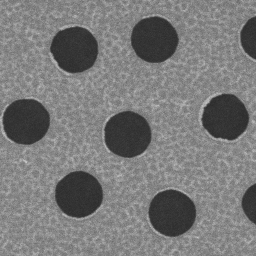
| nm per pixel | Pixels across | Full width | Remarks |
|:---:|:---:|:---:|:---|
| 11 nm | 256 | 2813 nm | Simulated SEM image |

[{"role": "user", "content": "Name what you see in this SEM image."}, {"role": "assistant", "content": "holes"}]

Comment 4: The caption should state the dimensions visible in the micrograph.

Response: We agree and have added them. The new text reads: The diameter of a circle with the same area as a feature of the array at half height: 0.515 um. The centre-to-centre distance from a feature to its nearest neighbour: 883 nm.